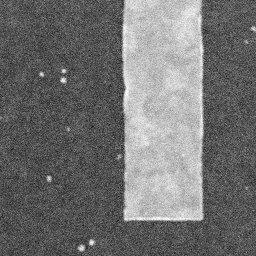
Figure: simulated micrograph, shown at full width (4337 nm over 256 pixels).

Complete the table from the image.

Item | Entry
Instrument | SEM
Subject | one or a few lines or trenches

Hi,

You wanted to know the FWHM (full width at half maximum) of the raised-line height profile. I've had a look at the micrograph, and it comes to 1.29 um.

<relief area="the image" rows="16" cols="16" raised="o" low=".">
........ooooo...
........oooo....
........ooooo...
........ooooo...
........ooooo...
........ooooo...
........ooooo...
........ooooo...
........ooooo...
........ooooo...
........ooooo...
........ooooo...
........ooooo...
........oooo....
................
................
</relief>